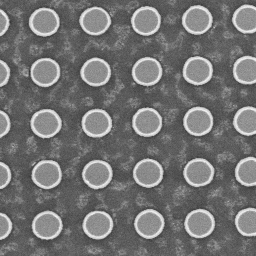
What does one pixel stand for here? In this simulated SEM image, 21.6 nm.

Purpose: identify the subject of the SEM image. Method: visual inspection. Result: a regular array of raised bodies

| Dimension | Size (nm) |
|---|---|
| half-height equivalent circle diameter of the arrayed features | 594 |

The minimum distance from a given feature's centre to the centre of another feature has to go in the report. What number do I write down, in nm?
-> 1090